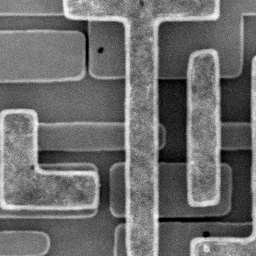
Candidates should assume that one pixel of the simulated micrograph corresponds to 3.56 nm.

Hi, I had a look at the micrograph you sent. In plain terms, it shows wiring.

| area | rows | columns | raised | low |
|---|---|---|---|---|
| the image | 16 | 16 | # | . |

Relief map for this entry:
....##########..
........##......
........##......
........##..#...
........##..##..
........##..##..
........##..##..
##......##..##..
##......##..##..
##......##..##..
###.....##..##..
######..##..##..
######..##..#...
........##......
........##......
........##..####